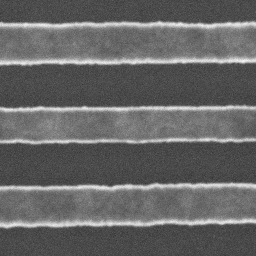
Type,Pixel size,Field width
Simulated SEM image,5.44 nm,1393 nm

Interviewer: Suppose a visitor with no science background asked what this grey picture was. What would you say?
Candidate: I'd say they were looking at lines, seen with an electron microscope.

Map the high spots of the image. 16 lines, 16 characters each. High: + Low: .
................
+++.++++++++.+++
++++++++++++++++
++++++++++++++++
................
................
................
++++++++++++++++
++++++++++++++++
................
................
................
++++++++++++++++
++++++++++++++++
................
................